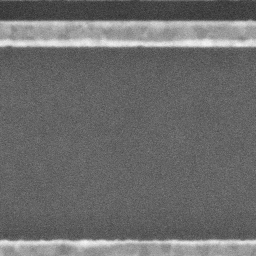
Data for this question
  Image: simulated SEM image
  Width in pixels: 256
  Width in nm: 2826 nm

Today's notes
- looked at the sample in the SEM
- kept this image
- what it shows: lines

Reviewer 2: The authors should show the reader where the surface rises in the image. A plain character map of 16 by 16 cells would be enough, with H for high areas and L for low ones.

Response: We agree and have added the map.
LLLLLLLLLLLLLLLL
HHHHHHHHHHHHHHHH
HHHHHHHHHHHHHHHH
LLLLLLLLLLLLLLLL
LLLLLLLLLLLLLLLL
LLLLLLLLLLLLLLLL
LLLLLLLLLLLLLLLL
LLLLLLLLLLLLLLLL
LLLLLLLLLLLLLLLL
LLLLLLLLLLLLLLLL
LLLLLLLLLLLLLLLL
LLLLLLLLLLLLLLLL
LLLLLLLLLLLLLLLL
LLLLLLLLLLLLLLLL
LLLLLLLLLLLLLLLL
HHHHHHHHHHHHHHHH